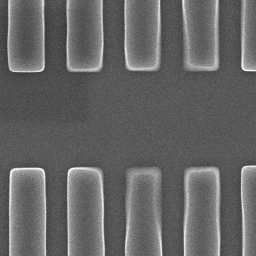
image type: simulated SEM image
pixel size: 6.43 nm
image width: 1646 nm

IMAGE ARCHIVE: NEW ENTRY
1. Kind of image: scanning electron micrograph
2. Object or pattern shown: groups of lines, slits or small figures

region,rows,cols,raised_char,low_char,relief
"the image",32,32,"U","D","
DUUUUDDDUUUUUDDDUUUUDDDUUUUDDDUU
DUUUUDDDUUUUUDDDUUUUDDDUUUUDDDUU
DUUUUDDDUUUUUDDDUUUUDDDUUUUDDDUU
DUUUUDDDUUUUUDDDUUUUDDDUUUUDDDUU
DUUUUDDDUUUUUDDDUUUUDDDUUUUDDDUU
DUUUUUDDUUUUUDDDUUUUDDDUUUUDDDUU
DUUUUUDDUUUUUDDDUUUUDDDUUUUDDDUU
DUUUUUDDUUUUUDDDUUUUDDDUUUUDDDUU
DUUUUDDDDUUUDDDDUUUDDDDDUUUDDDUU
DDDDDDDDDDDDDDDDDDDDDDDDDDDDDDDD
DDDDDDDDDDDDDDDDDDDDDDDDDDDDDDDD
DDDDDDDDDDDDDDDDDDDDDDDDDDDDDDDD
DDDDDDDDDDDDDDDDDDDDDDDDDDDDDDDD
DDDDDDDDDDDDDDDDDDDDDDDDDDDDDDDD
DDDDDDDDDDDDDDDDDDDDDDDDDDDDDDDD
DDDDDDDDDDDDDDDDDDDDDDDDDDDDDDDD
DDDDDDDDDDDDDDDDDDDDDDDDDDDDDDDD
DDDDDDDDDDDDDDDDDDDDDDDDDDDDDDDD
DDDDDDDDDDDDDDDDDDDDDDDDDDDDDDDD
DDDDDDDDDDDDDDDDDDDDDDDDDDDDDDDD
DDDDDDDDDDDDDDDDDDDDDDDDDDDDDDDD
DUUUUDDDDUUUDDDDDUUDDDDDUUUDDDUU
DUUUUUDDDUUUUDDDUUUUDDDUUUUDDDUU
DUUUUUDDUUUUUDDDUUUUDDDUUUUDDDUU
DUUUUUDDUUUUUDDDUUUUDDDUUUUDDDUU
DUUUUUDDUUUUUDDDUUUUDDDUUUUDDDUU
DUUUUUDDDUUUUDDDUUUUDDDUUUUDDDUU
DUUUUUDDDUUUUDDDUUUUDDDUUUUDDDUU
DUUUUUDDDUUUUDDDUUUUDDDUUUUDDDUU
DUUUUUDDDUUUUDDDUUUUDDDUUUUDDDUU
DUUUUUDDDUUUUDDDUUUUDDDUUUUDDDUU
DUUUUUDDDUUUUDDDUUUUDDDUUUUDDDUU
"